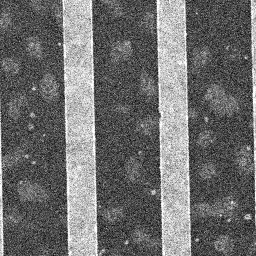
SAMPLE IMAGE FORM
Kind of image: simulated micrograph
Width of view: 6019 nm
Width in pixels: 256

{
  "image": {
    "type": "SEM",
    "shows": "one or a few lines or trenches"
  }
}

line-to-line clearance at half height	1550	nm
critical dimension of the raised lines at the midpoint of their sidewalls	655	nanometers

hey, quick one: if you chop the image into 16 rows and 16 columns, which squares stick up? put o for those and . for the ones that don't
....oo....oo....
....oo....oo....
....oo....oo....
....oo....oo....
....oo....oo....
....oo....oo....
....oo....oo....
....oo....oo....
....oo....oo....
....oo....oo....
....oo....oo....
....oo....oo....
....oo....oo....
....oo....oo....
....oo....oo....
....oo....oo....